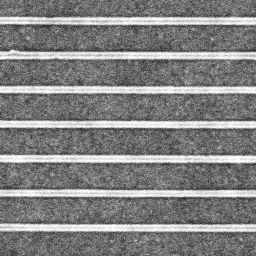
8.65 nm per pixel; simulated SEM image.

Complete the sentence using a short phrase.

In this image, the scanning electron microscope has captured parallel lines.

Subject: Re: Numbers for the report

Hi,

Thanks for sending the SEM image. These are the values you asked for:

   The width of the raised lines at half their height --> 44.3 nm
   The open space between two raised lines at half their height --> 251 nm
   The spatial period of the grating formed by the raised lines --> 34.4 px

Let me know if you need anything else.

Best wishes